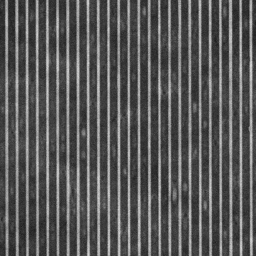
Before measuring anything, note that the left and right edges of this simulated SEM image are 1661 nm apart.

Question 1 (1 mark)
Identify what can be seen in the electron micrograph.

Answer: parallel lines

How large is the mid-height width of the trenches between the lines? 56 nm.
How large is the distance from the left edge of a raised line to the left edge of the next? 10.2 px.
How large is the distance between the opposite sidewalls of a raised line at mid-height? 0.0114 microns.